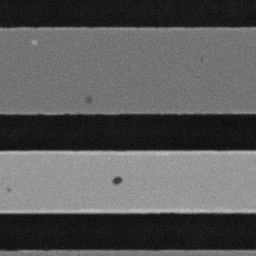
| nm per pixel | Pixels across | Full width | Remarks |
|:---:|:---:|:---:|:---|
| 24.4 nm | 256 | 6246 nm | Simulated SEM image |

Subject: lines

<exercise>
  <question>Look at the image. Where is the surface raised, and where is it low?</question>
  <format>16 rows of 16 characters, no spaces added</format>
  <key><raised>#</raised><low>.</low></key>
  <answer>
................
................
################
################
################
################
################
................
................
################
################
################
################
................
................
................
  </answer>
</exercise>